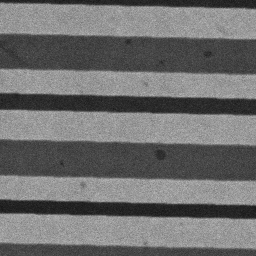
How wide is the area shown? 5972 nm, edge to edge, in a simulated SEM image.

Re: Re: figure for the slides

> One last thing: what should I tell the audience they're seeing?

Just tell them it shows lines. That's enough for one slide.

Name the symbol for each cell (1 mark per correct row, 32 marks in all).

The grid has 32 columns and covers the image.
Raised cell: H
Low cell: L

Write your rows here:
HHHHLLLLLLLLLLLLLLLLLLLLLLLLLLLL
HHHHHHHHHHHHHHHHHHHHHHHHHHHHHHHH
HHHHHHHHHHHHHHHHHHHHHHHHHHHHHHHH
HHHHHHHHHHHHHHHHHHHHHHHHHHHHHHHH
LLLLLLLLLLLLLLLLLLLHHHHHHHHHHHHH
LLLLLLLLLLLLLLLLLLLLLLLLLLLLLLLL
LLLLLLLLLLLLLLLLLLLLLLLLLLLLLLLL
LLLLLLLLLLLLLLLLLLLLLLLLLLLLLLLL
LLLLLLLLLLLLLLLLLLLLLLLLLLLLLLLL
HHHHHHHHHHHHHHHHHHHHHHHHHHHHHHHH
HHHHHHHHHHHHHHHHHHHHHHHHHHHHHHHH
HHHHHHHHHHHHHHHHHHHHHHHHHHHHHHHH
LLLLLLLLLLLLLLLLLLLLLLLLLLLLLLLL
LLLLLLLLLLLLLLLLLLLLLLLLLLLLLLLL
HHHHHHHHHHHHHHHHHHHHHHHHHHHHHHHH
HHHHHHHHHHHHHHHHHHHHHHHHHHHHHHHH
HHHHHHHHHHHHHHHHHHHHHHHHHHHHHHHH
LLLLLLHHHHHHHHHHHHHHHHHHHHHHHHHH
LLLLLLLLLLLLLLLLLLLLLLLLLLLLLLLL
LLLLLLLLLLLLLLLLLLLLLLLLLLLLLLLL
LLLLLLLLLLLLLLLLLLLLLLLLLLLLLLLL
LLLLLLLLLLLLLLLLLLLLLLLLLLLLLLLL
HHHHHHHHHHHHHHHHHHHHHHLLLLLLLLLL
HHHHHHHHHHHHHHHHHHHHHHHHHHHHHHHH
HHHHHHHHHHHHHHHHHHHHHHHHHHHHHHHH
LLLLLLLLLLLLLLLLLLLLLLLLLHHHHHHH
LLLLLLLLLLLLLLLLLLLLLLLLLLLLLLLL
HHHHHHHHHHHHHHHHHHHHHHHHHHHHHHHH
HHHHHHHHHHHHHHHHHHHHHHHHHHHHHHHH
HHHHHHHHHHHHHHHHHHHHHHHHHHHHHHHH
LLLLLLLLLLLHHHHHHHHHHHHHHHHHHHHH
LLLLLLLLLLLLLLLLLLLLLLLLLLLLLLLL